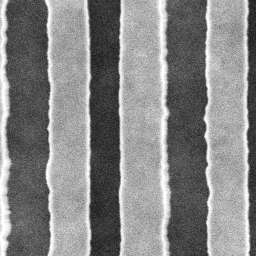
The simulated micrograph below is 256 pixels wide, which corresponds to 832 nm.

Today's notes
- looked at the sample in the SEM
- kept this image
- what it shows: lines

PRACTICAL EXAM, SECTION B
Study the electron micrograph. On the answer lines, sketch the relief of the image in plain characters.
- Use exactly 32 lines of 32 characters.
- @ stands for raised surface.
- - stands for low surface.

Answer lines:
@-----@@@@@----@@@@@------@@@@@-
@-----@@@@@----@@@@@------@@@@@-
@-----@@@@@----@@@@@------@@@@@-
@-----@@@@@----@@@@@------@@@@@-
------@@@@@----@@@@@------@@@@@-
------@@@@@----@@@@@------@@@@@-
------@@@@@----@@@@@------@@@@@-
@-----@@@@@----@@@@@------@@@@@-
------@@@@@----@@@@@------@@@@@-
------@@@@@----@@@@@------@@@@@-
@-----@@@@@----@@@@@@-----@@@@@-
@-----@@@@@----@@@@@@-----@@@@@-
@-----@@@@@----@@@@@------@@@@@-
@-----@@@@@----@@@@@@-----@@@@@-
@-----@@@@@----@@@@@@-----@@@@@-
@-----@@@@@----@@@@@@-----@@@@@-
------@@@@@----@@@@@------@@@@@-
@-----@@@@@----@@@@@------@@@@@-
@-----@@@@@----@@@@@@-----@@@@@-
@-----@@@@@----@@@@@@-----@@@@@-
@-----@@@@@----@@@@@@-----@@@@@-
@-----@@@@@----@@@@@@-----@@@@@-
------@@@@@----@@@@@@-----@@@@@-
------@@@@@----@@@@@@-----@@@@@-
------@@@@@----@@@@@@-----@@@@@-
@-----@@@@@----@@@@@@-----@@@@@-
@-----@@@@@----@@@@@@-----@@@@@-
@-----@@@@@----@@@@@@-----@@@@@-
@-----@@@@@----@@@@@@-----@@@@@-
------@@@@@----@@@@@@-----@@@@@-
@-----@@@@@----@@@@@@-----@@@@@-
------@@@@@----@@@@@@-----@@@@@-